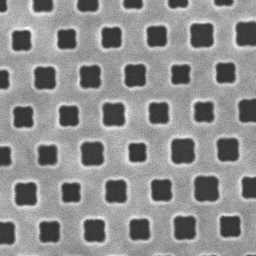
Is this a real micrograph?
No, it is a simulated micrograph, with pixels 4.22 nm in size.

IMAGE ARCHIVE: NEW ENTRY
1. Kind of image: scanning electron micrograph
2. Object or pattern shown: a regular array of holes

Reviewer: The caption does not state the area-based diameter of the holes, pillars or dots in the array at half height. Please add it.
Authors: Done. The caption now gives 98.6 nm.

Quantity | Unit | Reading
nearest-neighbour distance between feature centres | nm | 187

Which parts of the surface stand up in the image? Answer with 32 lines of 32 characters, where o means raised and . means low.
.ooo...ooo..ooo...ooo..oooo..ooo
.oooo.oooooooooooooooooooooooooo
oooooooooooooooooooooooooooooooo
ooooooooooooo..ooo...ooo...oo...
oo..ooo...ooo..ooo...ooo...oo...
o...ooo...ooo..oooo..ooo...ooo..
oooooooooooooooooooooooooooooooo
oooooooooooooooooooooooooooooooo
ooooo..ooo..oooo..ooo...ooo..ooo
.ooo...ooo...ooo..ooo...ooo..ooo
.ooo...ooo...ooo..oooooooooooooo
oooooooooooooooooooooooooooooooo
oooooooooooooooooooooooooooooo..
oo..ooo...ooo...ooo..ooo...ooo..
oo..ooo...ooo...ooo..ooo...ooo..
oo..oooo..ooo...oooooooooooooooo
oooooooooooooooooooooooooooooooo
oooooooooooooooooooooo..ooo...oo
.oooo..ooo...ooo..ooo...ooo...oo
.oooo..ooo...ooo..ooo...ooo...oo
.oooo..ooo...ooooooooooooooooooo
oooooooooooooooooooooooooooooooo
oooooooooooooo.oooo..ooo...ooo..
oo...ooo..ooo...ooo..ooo...ooo..
oo...ooo..ooo...ooo..ooo...ooo..
oo..oooooooooooooooooooooooooooo
oooooooooooooooooooooooooooooooo
ooooooooooo..oooo.oooo..oooo..oo
..ooo..ooo...ooo...ooo...oo...oo
..ooo..oooo..ooo...ooo..oooo..oo
.ooooooooooooooooooooooooooooooo
oooooooooooooooooooooooooooooooo